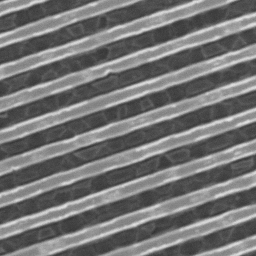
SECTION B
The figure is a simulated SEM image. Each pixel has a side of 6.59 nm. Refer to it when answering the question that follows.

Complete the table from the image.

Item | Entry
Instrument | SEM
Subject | parallel lines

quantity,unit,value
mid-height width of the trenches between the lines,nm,113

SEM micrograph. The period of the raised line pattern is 199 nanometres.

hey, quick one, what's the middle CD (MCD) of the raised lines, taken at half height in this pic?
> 82 nm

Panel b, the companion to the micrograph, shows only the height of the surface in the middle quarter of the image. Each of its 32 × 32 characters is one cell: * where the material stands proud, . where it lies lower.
........**********..............
.....**********..............***
..*********...............******
********...............*********
******..............**********..
***..............**********.....
*.............**********........
...........**********...........
........**********..............
.....**********..............***
..**********.............*******
*********.............**********
******.............***********..
***..............**********.....
.............***********........
..........**********............
.......***********.............*
....***********.............****
..*********..............*******
********..............**********
*****..............**********...
***.............**********......
.............**********.........
..........***********...........
.......***********.............*
....***********.............****
..*********..............*******
********..............**********
*****..............**********...
**..............**********......
.............**********.........
...........*********............